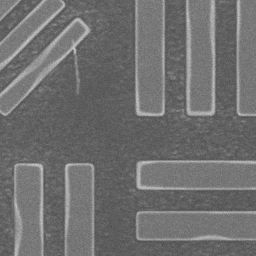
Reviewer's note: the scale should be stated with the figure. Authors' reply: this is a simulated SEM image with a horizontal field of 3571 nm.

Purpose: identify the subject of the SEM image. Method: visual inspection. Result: groups of lines, slits or small figures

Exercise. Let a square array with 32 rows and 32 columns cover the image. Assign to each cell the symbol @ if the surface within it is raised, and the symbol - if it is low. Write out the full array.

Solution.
@@---@@@---------@@@@--@@@@---@@
@---@@@----------@@@@--@@@@---@@
---@@@---@-------@@@@---@@@---@@
--@@@---@@@------@@@@---@@@---@@
-@@@---@@@@------@@@@---@@@---@@
@@@----@@@-------@@@----@@@---@@
@@----@@@--------@@@----@@@---@@
@----@@@---------@@@----@@@---@@
----@@-----------@@@----@@@---@@
---@@------------@@@@---@@@---@@
--@@-------------@@@@---@@@---@@
@@@@-------------@@@@---@@@---@@
@@@--------------@@@@---@@@---@@
@@---------------@@@----@@@---@@
--------------------------------
--------------------------------
--------------------------------
--------------------------------
--------------------------------
--------------------------------
------------------@@@@@@@@@@@@@@
--@@@---@@@@-----@@@@@@@@@@@@@@@
--@@@---@@@@-----@@@@@@@@@@@@@@@
--@@@---@@@@-------@@@@@@@@@@@@@
--@@@---@@@@--------------------
--@@@---@@@@--------------------
--@@@---@@@@------@@@@@@@@------
--@@@---@@@@-----@@@@@@@@@@@@@@@
--@@@---@@@@-----@@@@@@@@@@@@@@@
--@@@---@@@@-----@@@@@@@@@@@@@@@
--@@@---@@@@--------------------
--@@@---@@@@--------------------